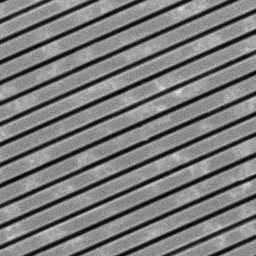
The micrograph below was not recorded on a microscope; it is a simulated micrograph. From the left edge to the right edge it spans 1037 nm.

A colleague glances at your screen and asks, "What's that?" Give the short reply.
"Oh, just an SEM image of parallel lines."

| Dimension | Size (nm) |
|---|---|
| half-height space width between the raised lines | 18.5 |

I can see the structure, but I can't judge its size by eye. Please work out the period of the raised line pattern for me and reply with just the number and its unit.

0.0761 microns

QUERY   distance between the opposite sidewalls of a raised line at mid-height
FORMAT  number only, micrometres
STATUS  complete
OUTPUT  0.0555